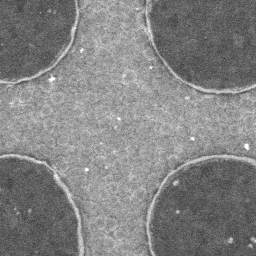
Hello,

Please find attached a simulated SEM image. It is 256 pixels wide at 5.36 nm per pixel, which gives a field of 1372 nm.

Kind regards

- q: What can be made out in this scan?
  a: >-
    raised bodies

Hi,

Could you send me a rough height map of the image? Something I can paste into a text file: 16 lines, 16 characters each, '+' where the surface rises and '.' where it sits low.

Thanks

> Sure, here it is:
+++++....+++++++
+++++....+++++++
++++......++++++
++++......++++++
+++........+++++
............++++
................
................
................
................
+++........+++++
++++......++++++
++++......++++++
+++++....+++++++
+++++....+++++++
+++++....+++++++